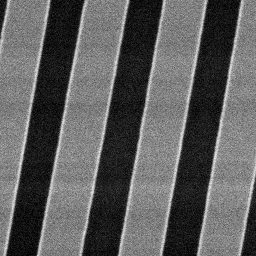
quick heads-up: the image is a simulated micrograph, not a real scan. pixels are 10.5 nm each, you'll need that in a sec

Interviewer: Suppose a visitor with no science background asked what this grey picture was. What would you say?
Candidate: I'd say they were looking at lines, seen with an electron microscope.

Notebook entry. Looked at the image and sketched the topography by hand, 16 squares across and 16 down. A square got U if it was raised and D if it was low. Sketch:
UUUDDUUUDDUUUDDU
UUUDDUUUDDUUUDDU
UUUDDUUUDDUUDDDU
UUUDDUUDDDUUDDDU
UUDDUUUDDUUUDDUU
UUDDUUUDDUUUDDUU
UUDDUUUDDUUUDDUU
UUDDUUUDDUUUDDUU
UUDDUUDDDUUDDDUU
UDDDUUDDDUUDDUUU
UDDUUUDDUUUDDUUU
UDDUUUDDUUUDDUUU
UDDUUUDDUUUDDUUU
UDDUUUDDUUUDDUUD
UDDUUDDDUUDDDUUD
DDUUUDDUUUDDUUUD